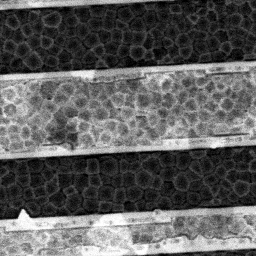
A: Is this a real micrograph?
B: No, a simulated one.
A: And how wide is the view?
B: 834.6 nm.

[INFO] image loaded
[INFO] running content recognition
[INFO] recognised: one or a few lines or trenches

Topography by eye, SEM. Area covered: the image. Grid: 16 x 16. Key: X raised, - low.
----------------
----------------
----------------
----------------
-------XXXXXXXXX
XXXXXXXXXXXXXXXX
XXXXXXXXXXXXXXXX
XXXXXXXXXXXXXXXX
XXXXXXXXXXXXXXXX
XXXXX-----------
----------------
----------------
----------------
-X------XXXXXXXX
XXXXXXXXXXXXXXXX
XXXXXXXXXXXXX---